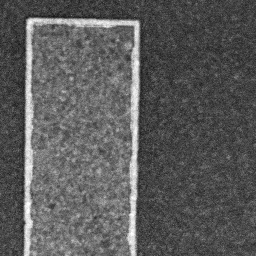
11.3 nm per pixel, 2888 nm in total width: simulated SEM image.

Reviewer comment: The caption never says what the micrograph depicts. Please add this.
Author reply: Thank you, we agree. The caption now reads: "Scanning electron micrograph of one or a few lines or trenches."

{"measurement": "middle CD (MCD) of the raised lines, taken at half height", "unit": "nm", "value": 1200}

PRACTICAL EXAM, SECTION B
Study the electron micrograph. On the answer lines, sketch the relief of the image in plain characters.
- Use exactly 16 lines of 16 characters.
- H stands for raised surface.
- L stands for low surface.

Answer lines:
LLLLLLLLLLLLLLLL
LLHHHHHHLLLLLLLL
LLHHHHHHLLLLLLLL
LLHHHHHHLLLLLLLL
LLHHHHHHHLLLLLLL
LLHHHHHHHLLLLLLL
LLHHHHHHLLLLLLLL
LLHHHHHHLLLLLLLL
LLHHHHHHLLLLLLLL
LLHHHHHHLLLLLLLL
LLHHHHHHLLLLLLLL
LLHHHHHHLLLLLLLL
LLHHHHHHLLLLLLLL
LLHHHHHHLLLLLLLL
LLHHHHHHLLLLLLLL
LLHHHHHHLLLLLLLL